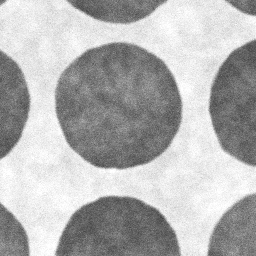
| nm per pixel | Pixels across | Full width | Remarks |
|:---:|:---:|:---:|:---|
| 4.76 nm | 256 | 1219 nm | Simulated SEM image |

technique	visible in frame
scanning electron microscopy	holes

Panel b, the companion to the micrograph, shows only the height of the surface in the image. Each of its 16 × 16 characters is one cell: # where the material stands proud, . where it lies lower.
#####.....#####.
################
################
.####.....####..
.###.......###..
..#........##...
..#........##...
..##.......##...
.###.......###..
.####.....####..
#######.########
################
######...######.
.###......####..
..##.......##...
..##.......##...